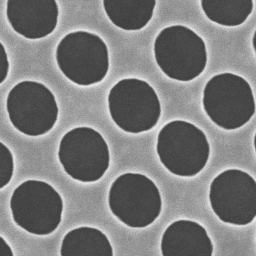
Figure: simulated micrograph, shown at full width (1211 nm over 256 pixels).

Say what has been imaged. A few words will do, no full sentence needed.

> a regular array of holes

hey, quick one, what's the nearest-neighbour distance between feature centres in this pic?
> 323 nm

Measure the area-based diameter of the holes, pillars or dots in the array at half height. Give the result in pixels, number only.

53.7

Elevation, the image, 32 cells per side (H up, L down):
HLLLLLLHHHHHHLLLLLLHHHHHHLLLLLLL
HLLLLLLHHHHHHLLLLLLHHHHHHHLLLLLH
HLLLLLLHHHHHHHLLLLLHHHHHHHLLLLLH
HHLLLLLHHHHHHHHLLLHHHLLLHHHHHHHH
HHHLLLHHLLLLHHHHHHHHLLLLLHHHHHHH
HHHHHHHLLLLLLHHHHHHLLLLLLLHHHHHH
LHHHHHHLLLLLLHHHHHHLLLLLLLHHHHHH
LHHHHHHLLLLLLLHHHHHLLLLLLLHHHHHH
LHHHHHHLLLLLLLHHHHHHLLLLLLHHHHHH
LHHHHHHHLLLLLHHHHHHHHLLLLHHLLLHH
HHLLLHHHHHLHHHLLLLLHHHHHHHLLLLLH
HLLLLLHHHHHHHHLLLLLHHHHHHLLLLLLL
HLLLLLLHHHHHHHLLLLLLHHHHHLLLLLLL
HLLLLLLHHHHHHHLLLLLLHHHHHHLLLLLL
HLLLLLLHHHHHHHLLLLLLHHHHHHLLLLLL
HHLLLLLHHHHHHHLLLLLHHLLLHHHLLLLH
HHHLLLHHHLLLHHHHLLHHLLLLLHHHHHHH
HHHHHHHHLLLLLHHHHHHHLLLLLLHHHHHH
LHHHHHHLLLLLLLHHHHHHLLLLLLHHHHHH
LLHHHHHLLLLLLLHHHHHHLLLLLLHHHHHH
LLHHHHHHLLLLLLHHHHHHLLLLLLHHHHHH
LLHHHHHHLLLLLHHHHHHHHLLLLHHHLLLH
LHHHHHHHHHLLHHLLLLLHHHHHHHHLLLLL
HHLLLLLHHHHHHHLLLLLLHHHHHHLLLLLL
HLLLLLLHHHHHHHLLLLLLHHHHHHLLLLLL
HLLLLLLLHHHHHHLLLLLLHHHHHHLLLLLL
HHLLLLLLHHHHHHLLLLLLHHHHHHHLLLLL
HHLLLLLLHHHHHHHLLLLHHHHHHHHHLLLL
HHHLLLLHHHLLHHHHHHHHHLLLLHHHHHHH
HHHHHHHHLLLLLHHHHHHHLLLLLLHHHHHH
LHHHHHHHLLLLLLHHHHHHLLLLLLLHHHHH
LLHHHHHHLLLLLLHHHHHHLLLLLLLHHHHH